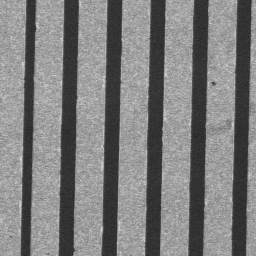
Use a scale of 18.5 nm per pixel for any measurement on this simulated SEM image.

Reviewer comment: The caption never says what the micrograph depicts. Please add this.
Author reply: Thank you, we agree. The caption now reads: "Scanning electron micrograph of parallel lines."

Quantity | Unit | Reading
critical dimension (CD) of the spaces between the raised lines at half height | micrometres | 0.289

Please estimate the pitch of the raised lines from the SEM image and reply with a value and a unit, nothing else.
793 nanometres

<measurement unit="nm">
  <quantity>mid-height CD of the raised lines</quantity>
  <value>502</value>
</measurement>